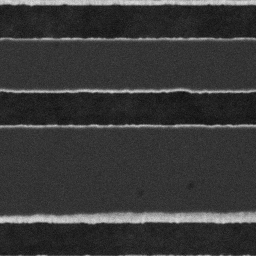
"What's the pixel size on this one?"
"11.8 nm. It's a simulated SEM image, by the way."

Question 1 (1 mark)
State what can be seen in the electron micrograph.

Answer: lines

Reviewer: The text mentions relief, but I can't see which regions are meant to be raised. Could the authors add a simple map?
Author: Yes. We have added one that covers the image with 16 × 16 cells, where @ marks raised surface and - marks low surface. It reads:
----------------
----------------
@@@@@@@@@@@@@@@@
@@@@@@@@@@@@@@@@
@@@@@@@@@@@@@@@@
@@@@@@@@@@@@@@@@
----------------
----------------
@@@@@@@@@@@@@@@@
@@@@@@@@@@@@@@@@
@@@@@@@@@@@@@@@@
@@@@@@@@@@@@@@@@
@@@@@@@@@@@@@@@@
@@@@@@@@@@@@@@@@
----------------
----------------